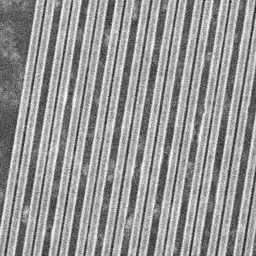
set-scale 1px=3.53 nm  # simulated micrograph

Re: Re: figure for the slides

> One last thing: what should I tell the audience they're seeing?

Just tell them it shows parallel lines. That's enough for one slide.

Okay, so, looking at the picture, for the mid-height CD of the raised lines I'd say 25.8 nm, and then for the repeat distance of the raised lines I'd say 45.7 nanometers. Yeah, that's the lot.